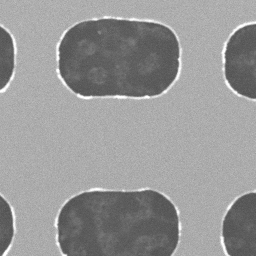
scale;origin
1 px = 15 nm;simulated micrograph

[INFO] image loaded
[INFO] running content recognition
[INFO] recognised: holes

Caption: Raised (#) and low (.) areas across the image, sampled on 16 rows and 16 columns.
################
#####.....######
.###.......###..
.###.......###..
.###.......###..
####......#####.
################
################
################
################
################
################
####.......####.
.###.......###..
.###.......###..
####.......###..